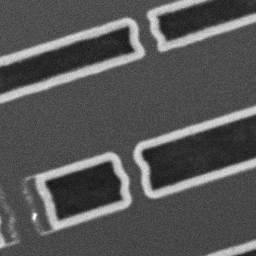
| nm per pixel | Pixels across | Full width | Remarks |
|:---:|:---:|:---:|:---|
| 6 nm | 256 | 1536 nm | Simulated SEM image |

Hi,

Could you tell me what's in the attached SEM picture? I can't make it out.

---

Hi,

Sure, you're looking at one or a few lines or trenches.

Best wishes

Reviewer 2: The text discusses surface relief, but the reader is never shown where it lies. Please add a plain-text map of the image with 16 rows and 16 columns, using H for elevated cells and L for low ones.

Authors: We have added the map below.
HHHHHHHHHHHLLLLL
HHHHHHHHHHLLLLLH
HHHHLLLLHHLLHHHH
HLLLLLLLHHHHHHHH
LLLLLHHHHHHHHHHH
LLHHHHHHHHHHHHHH
HHHHHHHHHHHHHHHH
HHHHHHHHHHHHHHLL
HHHHHHHHHHHLLLLL
HHHHHHHHHLLLLLLL
HHHHLLLHHLLLLLLH
HHHLLLLLHLLLHHHH
HHHLLLLLHHHHHHHH
HHHLLHHHHHHHHHHH
HHHHHHHHHHHHHHHH
HHHHHHHHHHHHHHHL